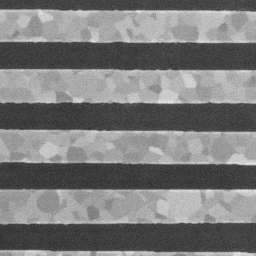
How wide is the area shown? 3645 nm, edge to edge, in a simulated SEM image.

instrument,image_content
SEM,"lines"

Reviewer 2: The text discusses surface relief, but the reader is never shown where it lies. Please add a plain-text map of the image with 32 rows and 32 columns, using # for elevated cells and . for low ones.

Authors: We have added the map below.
................................
##############################..
################################
################################
################################
................................
................................
................................
................................
################################
################################
################################
################################
................................
................................
................................
#######################.#.......
################################
################################
################################
...........................#.###
................................
................................
................................
################################
################################
################################
################################
................................
................................
................................
####################............